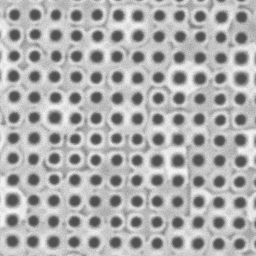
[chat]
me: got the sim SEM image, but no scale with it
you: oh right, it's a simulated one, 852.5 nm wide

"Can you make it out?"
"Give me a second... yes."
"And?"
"a regular array of holes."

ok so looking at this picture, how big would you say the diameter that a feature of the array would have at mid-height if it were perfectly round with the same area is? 35.6 nanometres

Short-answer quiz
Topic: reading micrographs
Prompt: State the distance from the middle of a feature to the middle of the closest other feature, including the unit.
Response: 66.8 nanometres